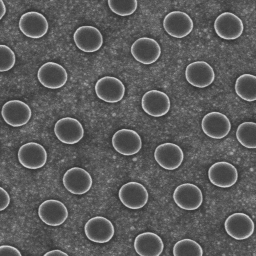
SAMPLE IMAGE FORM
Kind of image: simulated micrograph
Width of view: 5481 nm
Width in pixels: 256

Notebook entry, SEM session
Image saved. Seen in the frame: a regular array of raised bodies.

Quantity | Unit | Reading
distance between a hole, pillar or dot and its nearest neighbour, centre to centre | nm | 1000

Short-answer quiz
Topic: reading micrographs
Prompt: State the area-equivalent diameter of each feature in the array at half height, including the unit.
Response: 573 nm